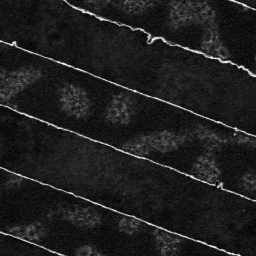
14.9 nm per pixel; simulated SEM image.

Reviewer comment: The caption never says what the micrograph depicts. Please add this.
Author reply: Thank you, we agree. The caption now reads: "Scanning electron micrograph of one or a few lines or trenches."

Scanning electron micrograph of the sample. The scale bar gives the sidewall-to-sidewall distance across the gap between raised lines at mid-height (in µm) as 0.857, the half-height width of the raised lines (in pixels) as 61.3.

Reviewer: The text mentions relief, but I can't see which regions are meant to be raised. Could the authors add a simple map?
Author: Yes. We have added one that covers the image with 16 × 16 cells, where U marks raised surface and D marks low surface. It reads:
DDDDDUUUUUUUUUUU
DDDDDDDUUUUUUUUU
DDDDDDDDDDUUUUUU
UUUDDDDDDDDDDUUU
UUUUUDDDDDDDDDDD
UUUUUUUUDDDDDDDD
UUUUUUUUUUUDDDDD
DDUUUUUUUUUUUDDD
DDDDDUUUUUUUUUUU
DDDDDDDDUUUUUUUU
DDDDDDDDDDDUUUUU
UUUDDDDDDDDDDUUU
UUUUUDDDDDDDDDDD
UUUUUUUUDDDDDDDD
UUUUUUUUUUUDDDDD
DDDUUUUUUUUUUUDD